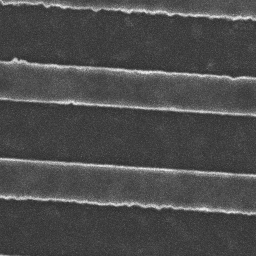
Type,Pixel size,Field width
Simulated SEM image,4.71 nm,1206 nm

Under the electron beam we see one or a few lines or trenches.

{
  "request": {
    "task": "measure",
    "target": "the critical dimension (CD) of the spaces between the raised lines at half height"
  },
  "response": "278 nm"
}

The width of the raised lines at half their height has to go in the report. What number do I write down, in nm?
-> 179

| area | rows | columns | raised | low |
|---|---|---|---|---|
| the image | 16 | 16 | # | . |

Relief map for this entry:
.....###########
................
................
................
##########......
################
.....###########
................
................
................
#########.......
#############.##
....############
................
................
................